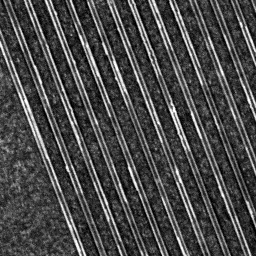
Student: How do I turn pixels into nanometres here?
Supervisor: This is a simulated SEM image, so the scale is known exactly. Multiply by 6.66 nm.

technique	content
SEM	parallel lines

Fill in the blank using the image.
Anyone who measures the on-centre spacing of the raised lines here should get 19.3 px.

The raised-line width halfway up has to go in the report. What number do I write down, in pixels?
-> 4.89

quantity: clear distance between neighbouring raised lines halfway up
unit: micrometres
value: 0.0918